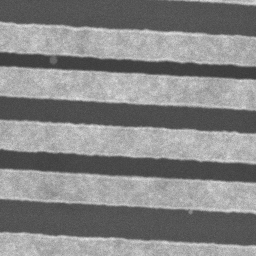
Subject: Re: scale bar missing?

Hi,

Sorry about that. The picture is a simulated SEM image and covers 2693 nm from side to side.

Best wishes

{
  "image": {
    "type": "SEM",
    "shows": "lines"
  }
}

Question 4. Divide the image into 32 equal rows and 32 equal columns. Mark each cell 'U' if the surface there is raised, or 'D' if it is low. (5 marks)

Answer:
DDDDDDDDDDDDDDDDDDDDDDDDDDDDDDUU
DDDDDDDDDDDDDDDDDDDDDDDDDDDDDDDD
DDDDDDDDDDDDDDDDDDDDDDDDDDDDDDDD
UUUUUUUUUUUUDDDDDDDDDDDDDDDDDDDD
UUUUUUUUUUUUUUUUUUUUUUUUUUUUUUDD
UUUUUUUUUUUUUUUUUUUUUUUUUUUUUUUU
UUUUUUUUUUUUUUUUUUUUUUUUUUUUUUUU
DDDDDDDDDDDDDDDDDUUUUUUUUUUUUUUU
UUUDDDDDDDDDDDDDDDDDDDDDDDDDDDDD
UUUUUUUUUUUUUUUUUUUUUUDDDDDDDDDD
UUUUUUUUUUUUUUUUUUUUUUUUUUUUUUUU
UUUUUUUUUUUUUUUUUUUUUUUUUUUUUUUU
DDDDDDDDDUUUUUUUUUUUUUUUUUUUUUUU
DDDDDDDDDDDDDDDDDDDDDDDDDDDDUUUU
DDDDDDDDDDDDDDDDDDDDDDDDDDDDDDDD
UUUUUUUUUDDDDDDDDDDDDDDDDDDDDDDD
UUUUUUUUUUUUUUUUUUUUUUUUUUDUDDDD
UUUUUUUUUUUUUUUUUUUUUUUUUUUUUUUU
UUUUUUUUUUUUUUUUUUUUUUUUUUUUUUUU
DDDDDDDDDDDDDDDDUUUUUUUUUUUUUUUU
DDDDDDDDDDDDDDDDDDDDDDDDDDDDDDDD
UUUUUUDDDDDDDDDDDDDDDDDDDDDDDDDD
UUUUUUUUUUUUUUUUUUUUUUUUDDDDDDDD
UUUUUUUUUUUUUUUUUUUUUUUUUUUUUUUU
UUUUUUUUUUUUUUUUUUUUUUUUUUUUUUUU
DDDDDDDDDDDDDUUUUUUUUUUUUUUUUUUU
DDDDDDDDDDDDDDDDDDDDDDDDDDDDDDUU
DDDDDDDDDDDDDDDDDDDDDDDDDDDDDDDD
DDDDDDDDDDDDDDDDDDDDDDDDDDDDDDDD
UUUUUUUUDDDDDDDDDDDDDDDDDDDDDDDD
UUUUUUUUUUUUUUUUUUUUUUUUUUDDDDDD
UUUUUUUUUUUUUUUUUUUUUUUUUUUUUUUU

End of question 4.